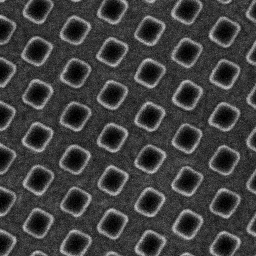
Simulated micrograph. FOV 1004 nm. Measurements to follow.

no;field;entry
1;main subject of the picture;a regular array of raised bodies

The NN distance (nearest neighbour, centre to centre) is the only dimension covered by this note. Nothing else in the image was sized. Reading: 167 nm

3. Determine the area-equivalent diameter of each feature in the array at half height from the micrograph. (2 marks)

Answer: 0.106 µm